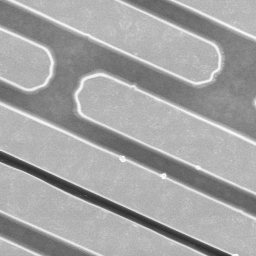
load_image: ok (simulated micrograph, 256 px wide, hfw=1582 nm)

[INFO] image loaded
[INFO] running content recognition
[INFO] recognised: one or a few lines or trenches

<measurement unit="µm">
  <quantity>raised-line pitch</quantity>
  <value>0.405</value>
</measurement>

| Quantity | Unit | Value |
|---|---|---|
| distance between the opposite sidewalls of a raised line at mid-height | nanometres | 275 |